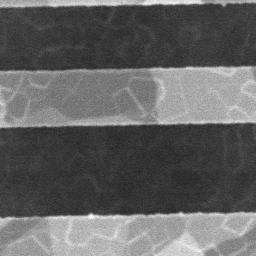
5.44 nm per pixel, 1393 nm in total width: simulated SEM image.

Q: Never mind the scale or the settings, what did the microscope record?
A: one or a few lines or trenches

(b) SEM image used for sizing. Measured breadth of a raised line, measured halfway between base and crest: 55.1 pixels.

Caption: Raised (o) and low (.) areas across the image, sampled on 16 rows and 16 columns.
................
................
................
................
oooooooooooooooo
oooooooooooooooo
oooooooooooooooo
oooooooooooooooo
................
................
................
................
................
.......ooooooooo
oooooooooooooooo
oooooooooooooooo